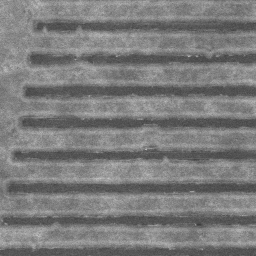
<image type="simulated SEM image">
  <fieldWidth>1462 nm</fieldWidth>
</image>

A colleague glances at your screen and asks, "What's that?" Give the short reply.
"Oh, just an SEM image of parallel lines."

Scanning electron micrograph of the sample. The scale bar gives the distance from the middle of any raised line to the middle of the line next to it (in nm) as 184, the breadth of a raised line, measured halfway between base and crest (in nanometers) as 87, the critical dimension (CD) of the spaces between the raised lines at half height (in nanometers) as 97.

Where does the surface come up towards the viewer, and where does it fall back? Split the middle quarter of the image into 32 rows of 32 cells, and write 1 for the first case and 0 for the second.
00111100000000000000000000000000
11111111111111111111111111111111
11111111111111111111111111111111
11111111111111111111111111111111
11110000000000001111111111111111
00000000000000000000000000000000
00000000000000000000000000000000
00000000000000000000000000000000
00000000000000000000000000000000
11111111111111111111111111111111
11111111111111111111111111111111
11111111111111111111111111111111
00001110001111111111000000000000
00000000000000000000000000000000
00000000000000000000000000000000
00000000000000000000000000000000
00000000000000000000000000000000
11111111111111111111111111111111
11111111111111111111111111111111
11111111111111111111111111111111
11111111111111111110000000000000
00000000000000000000000000000000
00000000000000000000000000000000
00000000000000000000000000000000
00000000000000000000000001000000
11111111111111111111111111111111
11111111111111111111111111111111
11111111111111111111111111111111
11111111111111111111111111111111
00000000000000000000000000000000
00000000000000000000000000000000
00000000000000000000000000000000